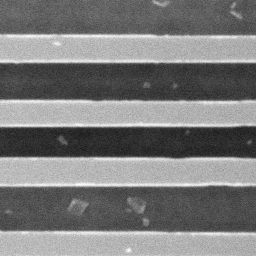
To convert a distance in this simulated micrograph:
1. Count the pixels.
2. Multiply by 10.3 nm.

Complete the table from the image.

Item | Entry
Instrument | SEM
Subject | lines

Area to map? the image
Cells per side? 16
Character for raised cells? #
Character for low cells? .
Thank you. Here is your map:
................
................
################
################
................
................
################
################
................
................
################
################
................
................
................
################